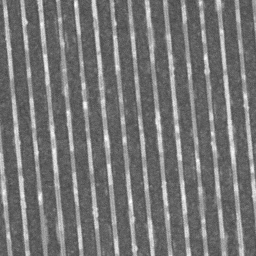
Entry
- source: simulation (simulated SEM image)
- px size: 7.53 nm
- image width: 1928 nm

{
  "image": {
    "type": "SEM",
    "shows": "parallel lines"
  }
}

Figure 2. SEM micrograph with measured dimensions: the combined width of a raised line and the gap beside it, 134 nm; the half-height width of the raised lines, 25.3 nm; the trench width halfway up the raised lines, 0.107 µm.